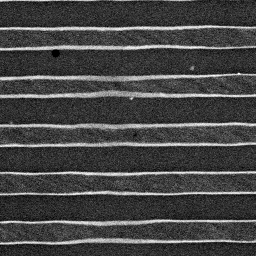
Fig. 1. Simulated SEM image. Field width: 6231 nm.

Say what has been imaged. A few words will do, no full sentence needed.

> wiring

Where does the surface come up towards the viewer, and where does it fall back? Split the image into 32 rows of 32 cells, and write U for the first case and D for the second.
DDDDDDDDDDDDDDDDDDDDDDDDDDDDDDDD
DDDDDDDDDDDDDDDDDDDDDDDDDDDDDDDD
DDDDDDDDDDDDDDDDDDDDDDDDDDDDDDDD
DDDDDDDDDDDDDDDDDDDDDDDDUUUUUUUD
UUUUUUUUUUUUUUUUUUUUUUUUUUUUUUUU
UUUUUUUUUUUUUUUUUUUUUUUUUUUUUUUU
DDDDDDDDDDDDDDDDDDDDDDDDDDDDDDDD
DDDDDDDDDDDDDDDDDDDDDDDDDDDDDDDD
DDDDDDDDDDDDDDDDDDDDDDDDDDDDDDDD
DDDDDDDDDDDDDDDDDDDDDDDDDDDUUUUU
UUUUUUUUUUUUUUUUUUUUUUUUUUUUUUUU
UUUUUUUUUUUUUUUUUUUUUUUUUUUUUUUU
DDDDDDDDDDDDDDDDDDDDDDDDDDDDDDDD
DDDDDDDDDDDDDDDDDDDDDDDDDDDDDDDD
DDDDDDDDDDDDDDDDDDDDDDDDDDDDDDDD
DDDDDDDDDDDDDDDDDDDDDDDDDDDDDDDD
UUUUUUUUUUUUUUUUUUUUUUUUUUUUUUUU
UUUUUUUUUUUUUUUUUUUUUUUUUUUUUUUU
DDDDDDDDDDDDDDDDDDDDDDDDDDDDDDDD
DDDDDDDDDDDDDDDDDDDDDDDDDDDDDDDD
DDDDDDDDDDDDDDDDDDDDDDDDDDDDDDDD
DDDDDDDDDDDDDDDDDDDDDDDDDDDDDDDD
UUUUUUUUUUUUUUUUUUUUUUUUUUUUUUUU
UUUUUUUUUUUUUUUUUUUUUUUUUUUUUUUU
DDDDDDDDDDDDDDDDDDDDDDDDDDDDDDDD
DDDDDDDDDDDDDDDDDDDDDDDDDDDDDDDD
DDDDDDDDDDDDDDDDDDDDDDDDDDDDDDDD
DDDDDDDDDDDDDDDDDDDDDDDDDDDDDDDD
UUUUUUUUUUUUUUUUUUUUUUUUUUUUUUUU
UUUUUUUUUUUUUUUUUUUUUUUUUUUUUUUU
DDDDDDDDDDDDDDDDDDDDDDDDDDDDDDDD
DDDDDDDDDDDDDDDDDDDDDDDDDDDDDDDD